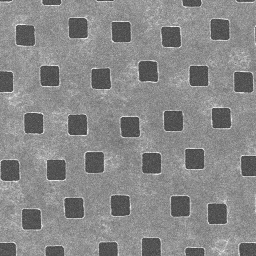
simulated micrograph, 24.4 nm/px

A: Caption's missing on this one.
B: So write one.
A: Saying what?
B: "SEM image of a regular array of holes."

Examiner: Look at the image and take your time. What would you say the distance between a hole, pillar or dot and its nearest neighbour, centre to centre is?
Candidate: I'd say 1040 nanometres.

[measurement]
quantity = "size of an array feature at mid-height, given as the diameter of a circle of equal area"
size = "548 nm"